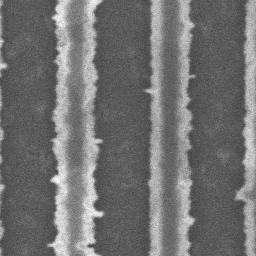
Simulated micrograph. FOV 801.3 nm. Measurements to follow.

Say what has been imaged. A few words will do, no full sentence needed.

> one or a few lines or trenches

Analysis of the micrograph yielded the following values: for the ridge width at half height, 91.9 nm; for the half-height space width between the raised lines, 0.202 um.